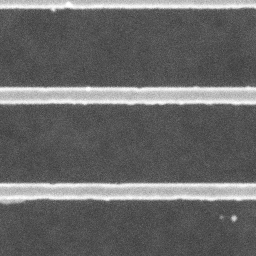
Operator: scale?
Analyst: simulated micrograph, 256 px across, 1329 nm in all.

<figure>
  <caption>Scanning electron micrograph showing lines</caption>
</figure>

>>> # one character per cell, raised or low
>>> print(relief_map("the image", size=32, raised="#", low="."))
################################
................................
................................
................................
................................
................................
................................
................................
................................
................................
................................
################################
################################
................................
................................
................................
................................
................................
................................
................................
................................
................................
................................
################################
################################
................................
................................
................................
................................
................................
................................
................................